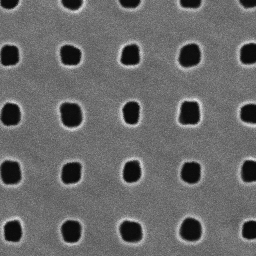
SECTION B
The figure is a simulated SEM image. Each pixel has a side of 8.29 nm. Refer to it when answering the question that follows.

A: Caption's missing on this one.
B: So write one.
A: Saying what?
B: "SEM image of a regular array of holes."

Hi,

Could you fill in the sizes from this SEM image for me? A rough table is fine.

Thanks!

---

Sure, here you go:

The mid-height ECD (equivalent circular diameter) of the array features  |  179 nm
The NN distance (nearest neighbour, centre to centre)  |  0.483 microns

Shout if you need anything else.